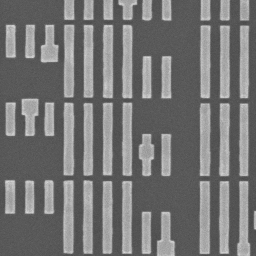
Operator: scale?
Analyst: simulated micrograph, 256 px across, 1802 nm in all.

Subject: wiring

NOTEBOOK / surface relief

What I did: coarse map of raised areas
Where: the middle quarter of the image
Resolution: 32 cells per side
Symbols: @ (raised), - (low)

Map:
@@---@@---@@---@@---@@--@@@-----
@@---@@---@@---@@---@@--@@@-----
@@---@@---@@---@@---@@--@@@-----
@@---@@---@@---@@---@@--@@@-----
@@---@@---@@---@@---@@--@@@-----
@@---@@---@@---@@---@@--@@@-----
@@---@@---@@---@@---@@--@@@-----
@@---@@---@@---@@---@@--@@@-----
--------------------------------
--------------------------------
@@---@@---@@---@@---------------
@@---@@---@@---@@---------------
@@---@@---@@---@@---------------
@@---@@---@@---@@---------------
@@---@@---@@---@@---------------
@@---@@---@@---@@---------------
@@---@@---@@---@@---------------
@@---@@---@@---@@---------------
@@---@@---@@---@@---@@--@@@-----
@@---@@---@@---@@---@@--@@------
@@---@@---@@---@@--@@@--@@------
@@---@@---@@---@@--@@@--@@------
@@---@@---@@---@@--@@@--@@------
@@---@@---@@---@@--@@@--@@------
@@---@@---@@---@@---@@--@@------
@@---@@---@@---@@---@@--@@------
@@---@@---@@---@@---@@--@@------
@@---@@---@@---@@---@@--@@------
--------------------------------
@@---@@---@@---@@---------------
@@---@@---@@---@@---------------
@@---@@---@@---@@---------------